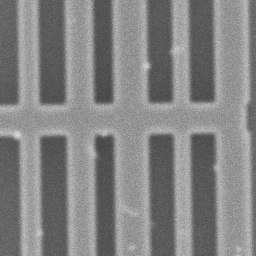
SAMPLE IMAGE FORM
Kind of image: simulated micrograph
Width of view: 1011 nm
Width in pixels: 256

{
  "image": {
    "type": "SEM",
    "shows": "groups of lines, slits or small figures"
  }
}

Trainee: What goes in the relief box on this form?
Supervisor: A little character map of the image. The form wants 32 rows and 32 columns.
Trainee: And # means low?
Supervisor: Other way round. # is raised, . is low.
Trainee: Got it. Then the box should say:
..###...###...####....#....####.
..###...####..####....#....####.
..###...####..####....#....####.
..###...####..####....#....####.
..###...####..####....#....####.
..###...####..####....##...####.
..###...####..####....##...####.
..###...####..####....##...####.
..###...####..#####...##...####.
..###...####..####....##...####.
..###...####..####....##...####.
...##...####..####....##...####.
...##...####..#####...##...####.
###############################.
###############################.
###############################.
###############################.
..###...####..#####...##...####.
...##...####..#####...##...####.
...##...####..#####...##...####.
...##...####..#####...##...####.
...##...####..#####...##...####.
...##....###..#####...##...####.
...##....###..#####...##...####.
...##....###..#####...##...####.
...##....###..#####...##...####.
...##....###..#####...##...####.
...##....###...####...##...####.
...##....###...####...##...####.
...##....###...####...##...####.
...##....###...####...##...####.
...##....###...####...##...####.